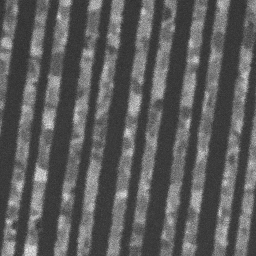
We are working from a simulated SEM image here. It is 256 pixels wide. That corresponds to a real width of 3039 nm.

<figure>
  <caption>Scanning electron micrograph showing parallel lines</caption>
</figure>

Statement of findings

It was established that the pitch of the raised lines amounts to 308 nanometres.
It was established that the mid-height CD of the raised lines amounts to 0.123 micrometres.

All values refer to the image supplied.